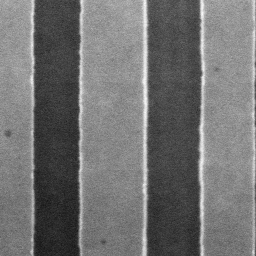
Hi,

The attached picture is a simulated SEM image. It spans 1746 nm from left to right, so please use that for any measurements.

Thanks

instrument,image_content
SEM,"lines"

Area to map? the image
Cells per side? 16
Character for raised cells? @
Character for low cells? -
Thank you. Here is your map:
@@---@@@@----@@@
@@---@@@@----@@@
@@---@@@@----@@@
@@---@@@@----@@@
@@---@@@@----@@@
@@---@@@@----@@@
@@---@@@@----@@@
@@---@@@@----@@@
@@---@@@@----@@@
@@---@@@@----@@@
@@---@@@@----@@@
@@---@@@@----@@@
@@---@@@@----@@@
@@---@@@@----@@@
@@---@@@@----@@@
@@---@@@@----@@@